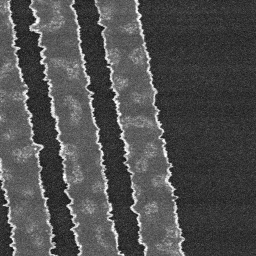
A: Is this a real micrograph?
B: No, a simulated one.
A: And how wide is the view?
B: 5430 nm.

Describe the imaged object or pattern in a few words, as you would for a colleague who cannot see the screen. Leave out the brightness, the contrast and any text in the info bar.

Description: one or a few lines or trenches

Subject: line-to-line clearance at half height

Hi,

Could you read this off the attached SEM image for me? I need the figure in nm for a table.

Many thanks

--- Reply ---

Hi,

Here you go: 511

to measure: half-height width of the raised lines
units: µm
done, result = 0.821